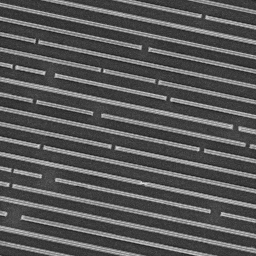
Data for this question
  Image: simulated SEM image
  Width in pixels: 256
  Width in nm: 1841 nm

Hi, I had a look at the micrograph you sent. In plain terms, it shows parallel lines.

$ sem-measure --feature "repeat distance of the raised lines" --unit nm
105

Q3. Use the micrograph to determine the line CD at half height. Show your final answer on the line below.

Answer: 21.1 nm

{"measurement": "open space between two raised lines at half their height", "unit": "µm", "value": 0.0818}